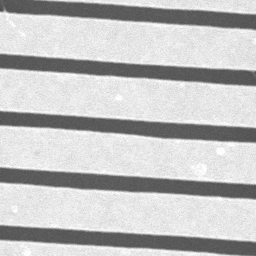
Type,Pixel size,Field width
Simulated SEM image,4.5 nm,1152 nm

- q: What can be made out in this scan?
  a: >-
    lines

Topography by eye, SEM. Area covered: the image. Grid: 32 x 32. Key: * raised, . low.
.............*******************
*..........................*****
*************...................
***************************.....
********************************
********************************
********************************
............********************
...........................*****
*************...................
****************************....
********************************
********************************
********************************
..........**********************
.........................*******
************....................
************************........
********************************
********************************
********************************
.........***********************
.......................*********
********........................
*************************.......
********************************
********************************
********************************
......**************************
......................**********
*******.........................
************************........